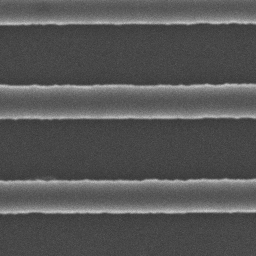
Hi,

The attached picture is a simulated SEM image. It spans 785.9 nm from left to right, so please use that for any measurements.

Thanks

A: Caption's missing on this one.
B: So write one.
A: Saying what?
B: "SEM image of lines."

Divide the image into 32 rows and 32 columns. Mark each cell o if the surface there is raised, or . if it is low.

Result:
oooooooooooooooooooooooooooooooo
oooooooooooooooooooooooooooooooo
oooooooooooooooooooooooooooooooo
................................
................................
................................
................................
................................
................................
................................
................................
oooooooooooooooooooooooooooooooo
oooooooooooooooooooooooooooooooo
oooooooooooooooooooooooooooooooo
oooooooooooooooooooooooooooooooo
................................
................................
................................
................................
................................
................................
................................
..........o.......ooo..ooooooooo
oooooooooooooooooooooooooooooooo
oooooooooooooooooooooooooooooooo
oooooooooooooooooooooooooooooooo
oooo.ooooooooooooooooooo........
................................
................................
................................
................................
................................